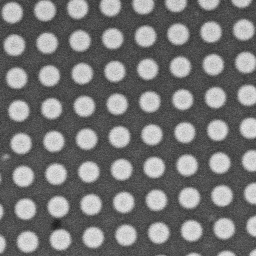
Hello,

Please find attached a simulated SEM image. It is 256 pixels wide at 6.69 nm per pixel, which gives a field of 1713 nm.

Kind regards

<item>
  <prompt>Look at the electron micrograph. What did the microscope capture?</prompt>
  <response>an array of small figures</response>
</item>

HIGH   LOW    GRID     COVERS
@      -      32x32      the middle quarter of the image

---@@@-----@@@@----@@@@----@@@@-
--@@@@@---@@@@@---@@@@@----@@@@@
--@@@@@---@@@@@----@@@@----@@@@-
--@@@@@----@@@@-----@@----------
---@@@--------------------------
--------------------------------
--------------------------------
--------------------@@@-----@@@@
----@@-----@@@@----@@@@@---@@@@@
---@@@@----@@@@@---@@@@@---@@@@@
---@@@@@---@@@@@---@@@@@----@@@@
---@@@@----@@@@-----@@@---------
---@@@@------@------------------
--------------------------------
--------------------------------
---------------------@@-----@@@@
-----@@-----@@@@----@@@@----@@@@
---@@@@@---@@@@@----@@@@----@@@@
---@@@@@---@@@@@----@@@@----@@@@
---@@@@@----@@@@----@@@@-----@@-
----@@@@-----@@-----------------
--------------------------------
--------------------------------
----------------------@------@@@
-------------@@@----@@@@@---@@@@
----@@@@----@@@@@---@@@@@---@@@@
----@@@@@---@@@@@---@@@@@---@@@@
----@@@@@---@@@@@----@@@@----@@@
----@@@@-----@@@----------------
--------------------------------
--------------------------------
------------------------------@@